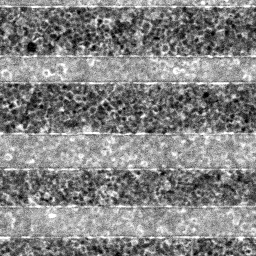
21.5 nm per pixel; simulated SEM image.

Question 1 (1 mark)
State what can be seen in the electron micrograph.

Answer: one or a few lines or trenches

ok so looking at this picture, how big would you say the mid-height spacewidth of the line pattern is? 0.648 microns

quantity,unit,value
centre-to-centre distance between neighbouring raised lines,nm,1680